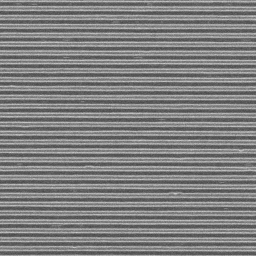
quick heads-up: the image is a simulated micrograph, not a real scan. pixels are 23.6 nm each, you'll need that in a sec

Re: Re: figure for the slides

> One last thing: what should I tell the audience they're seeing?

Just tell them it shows parallel lines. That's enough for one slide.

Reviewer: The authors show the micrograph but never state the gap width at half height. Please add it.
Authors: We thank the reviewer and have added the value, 118 nm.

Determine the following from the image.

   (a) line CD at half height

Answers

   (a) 100 nm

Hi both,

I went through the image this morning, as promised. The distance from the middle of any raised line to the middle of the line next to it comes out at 209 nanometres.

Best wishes